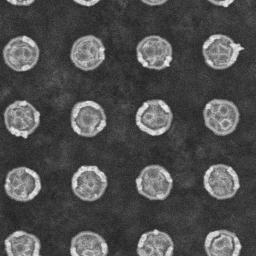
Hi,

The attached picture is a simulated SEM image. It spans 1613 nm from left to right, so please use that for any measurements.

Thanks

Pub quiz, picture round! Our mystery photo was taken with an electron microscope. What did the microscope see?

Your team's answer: a regular array of raised bodies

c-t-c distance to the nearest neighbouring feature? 409 nanometres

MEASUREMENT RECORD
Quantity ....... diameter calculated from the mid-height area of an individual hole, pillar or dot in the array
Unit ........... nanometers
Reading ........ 214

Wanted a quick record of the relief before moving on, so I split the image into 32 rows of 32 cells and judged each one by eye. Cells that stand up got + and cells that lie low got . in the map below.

..++......++.......+.......++...
................................
................................
................................
...........................+....
.+++.....++++.....+++.....++++..
.++++....++++....++++....+++++..
.++++....++++....++++.....+++...
..++......++.......+.......+....
................................
................................
................................
................................
.+++.....++++.....+++.....+++...
.++++....++++....++++.....++++..
.++++....++++....++++.....++++..
.+++......++......+++......++...
................................
................................
................................
................................
.+++......+++.....+++.....+++...
.++++....++++....++++.....++++..
.++++....++++....++++.....++++..
.+++......++......+++......++...
................................
................................
................................
................................
.+++......++......+++.....+++...
.++++....++++....+++++....++++..
.++++....++++....+++++....++++..